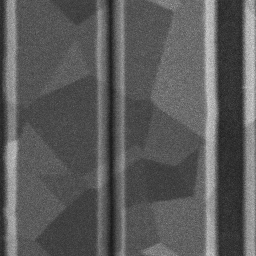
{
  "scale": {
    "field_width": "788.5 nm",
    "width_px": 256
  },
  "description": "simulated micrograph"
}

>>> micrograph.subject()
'one or a few lines or trenches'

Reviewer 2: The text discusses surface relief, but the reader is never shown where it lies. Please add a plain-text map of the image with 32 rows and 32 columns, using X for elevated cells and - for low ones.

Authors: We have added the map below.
-XXXXXXXXXXXX--XXXXXXXXXXX-----X
-XXXXXXXXXXXX--XXXXXXXXXXX-----X
-XXXXXXXXXXXX--XXXXXXXXXXX-----X
-XXXXXXXXXXXX--XXXXXXXXXXX-----X
-XXXXXXXXXXXX--XXXXXXXXXXX-----X
-XXXXXXXXXXXX--XXXXXXXXXXX-----X
-XXXXXXXXXXXX--XXXXXXXXXXX-----X
-XXXXXXXXXXXX--XXXXXXXXXXX-----X
-XXXXXXXXXXXX--XXXXXXXXXXX-----X
-XXXXXXXXXXXX--XXXXXXXXXXX-----X
-XXXXXXXXXXXX--XXXXXXXXXXX-----X
-XXXXXXXXXXXX--XXXXXXXXXXX-----X
-XXXXXXXXXXXX--XXXXXXXXXXX-----X
-XXXXXXXXXXXX--XXXXXXXXXXX-----X
-XXXXXXXXXXXX--XXXXXXXXXXX-----X
--XXXXXXXXXXX--XXXXXXXXXXX-----X
--XXXXXXXXXXX--XXXXXXXXXXX-----X
--XXXXXXXXXXX--XXXXXXXXXXX-----X
--XXXXXXXXXXX--XXXXXXXXXXX-----X
--XXXXXXXXXXX--XXXXXXXXXXX-----X
--XXXXXXXXXXX--XXXXXXXXXXX-----X
--XXXXXXXXXXX--XXXXXXXXXXX-----X
--XXXXXXXXXXX--XXXXXXXXXXX-----X
--XXXXXXXXXXX--XXXXXXXXXXX-----X
-XXXXXXXXXXXX--XXXXXXXXXXX-----X
-XXXXXXXXXXXX--XXXXXXXXXXX-----X
-XXXXXXXXXXXX--XXXXXXXXXXX-----X
-XXXXXXXXXXXX--XXXXXXXXXXX-----X
--XXXXXXXXXXX--XXXXXXXXXXX-----X
-XXXXXXXXXXXX--XXXXXXXXXXX-----X
-XXXXXXXXXXXX--XXXXXXXXXXX-----X
--XXXXXXXXXXX--XXXXXXXXXXX-----X